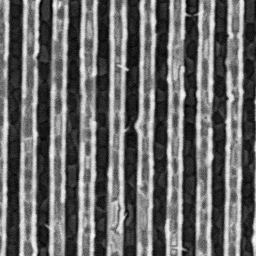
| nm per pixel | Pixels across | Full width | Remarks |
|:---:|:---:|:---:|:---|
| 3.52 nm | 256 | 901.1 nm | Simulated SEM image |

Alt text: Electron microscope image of parallel lines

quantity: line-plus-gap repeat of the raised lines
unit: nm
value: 103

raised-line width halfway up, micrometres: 0.0536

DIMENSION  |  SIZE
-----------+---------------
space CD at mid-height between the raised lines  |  50.1 nm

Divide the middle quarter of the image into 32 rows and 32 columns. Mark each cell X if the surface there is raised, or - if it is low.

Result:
X---XXXX----XXX----XXXX---XXXX--
X---XXXX----XXXX---XXXX---XXXX--
X---XXXX----XXX----XXX----XXXX--
X---XXXX----XXX----XXX----XXXX--
X---XXXX----XXX----XXX----XXXX--
----XXXX----XXX----XXX----XXXX--
----XXXX----XXX----XXX----XXXX--
-----XXX---XXXX----XXXX---XXXX--
-----XXX----XXX----XXXX---XXXX--
----XXXX----XXX----XXXX---XXXX--
X---XXXX----XXX----XXXX---XXXX--
X---XXXX----XXX----XXXX---XXXX--
----XXXX----XXX----XXX----XXXX--
X---XXXX----XXX----XXX----XXXX--
----XXXX----XXX---XXXX----XXXX--
----XXXX----XXX---XXXX----XXXX--
----XXXX----XXX---XXXX----XXXX--
----XXXX----XXX----XXX----XXXX--
----XXXX----XXX----XXX----XXXX--
----XXXX---XXXX----XXX----XXXX--
----XXXX---XXXX----XXX----XXXX--
----XXXX---XXXX----XXX----XXXX--
----XXXX---XXXX----XXX----XXX---
----XXXX---XXXX----XXX----XXXX--
----XXXX---XXXX----XXX----XXXX--
----XXXX---XXXX----XXX----XXXX--
----XXXX---XXXX---XXXX----XXXX--
----XXXX---XXXX---XXXX----XXXX--
----XXXX---XXXX---XXXX----XXXX--
----XXXX---XXXX---XXXX----XXX---
----XXXX---XXXX---XXXX----XXX---
----XXX----XXXX---XXXX----XXX---